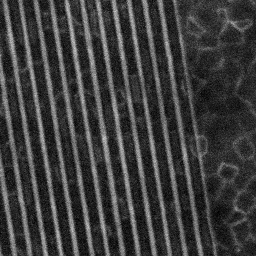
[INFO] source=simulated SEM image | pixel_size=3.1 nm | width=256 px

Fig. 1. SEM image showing parallel lines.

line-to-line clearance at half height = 11.5 pixels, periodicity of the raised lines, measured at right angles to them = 47.5 nm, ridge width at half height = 0.0111 micrometres